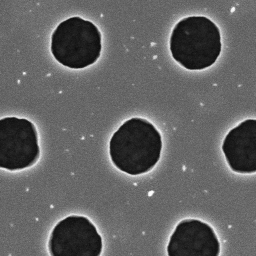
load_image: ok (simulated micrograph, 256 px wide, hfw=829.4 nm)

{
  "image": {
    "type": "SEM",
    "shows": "holes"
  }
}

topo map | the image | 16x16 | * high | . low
****************
****..*****..***
***...*****...**
***...*****...**
****************
****************
****************
..******.*******
..*****...****..
..*****...****..
.******..******.
****************
****************
****************
***...*****..***
***...****....**